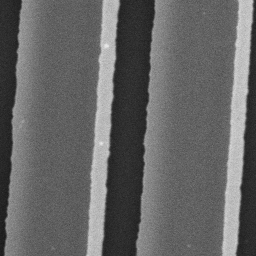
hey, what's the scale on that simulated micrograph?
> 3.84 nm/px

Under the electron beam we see lines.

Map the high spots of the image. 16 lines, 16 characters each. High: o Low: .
.oooooo...oooooo
.oooooo...oooooo
.oooooo...oooooo
.oooooo..ooooooo
.oooooo..ooooooo
.oooooo..oooooo.
.oooooo..oooooo.
.oooooo..oooooo.
.oooooo..oooooo.
.oooooo..oooooo.
.oooooo..oooooo.
.oooooo..oooooo.
.oooooo..oooooo.
ooooooo..oooooo.
oooooo...oooooo.
oooooo...oooooo.